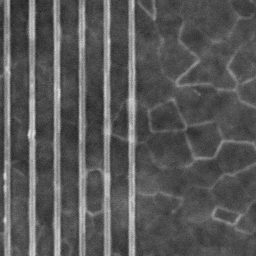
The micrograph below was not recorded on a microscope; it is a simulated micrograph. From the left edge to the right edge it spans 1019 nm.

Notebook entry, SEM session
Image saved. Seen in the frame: parallel lines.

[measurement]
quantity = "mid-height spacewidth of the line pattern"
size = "82.1 nm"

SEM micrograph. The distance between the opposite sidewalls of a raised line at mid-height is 17.9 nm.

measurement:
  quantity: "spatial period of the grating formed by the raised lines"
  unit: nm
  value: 99.2